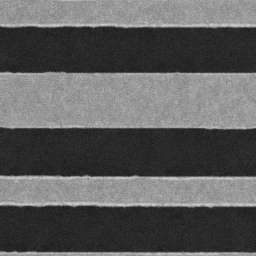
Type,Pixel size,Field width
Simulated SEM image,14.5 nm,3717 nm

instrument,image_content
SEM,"lines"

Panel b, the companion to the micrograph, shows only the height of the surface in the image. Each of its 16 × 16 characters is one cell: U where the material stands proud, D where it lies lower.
UUUUUUUUUUUUUUUU
UUUUUUUUUUUUUUUU
DDDDDDDDDDDDDDDD
DDDDDDDDDDDDDDDD
DDDDDDDDDDDDDDDD
UUUUUUUUUUUUUUUU
UUUUUUUUUUUUUUUU
UUUUUUUUUUUUUUUU
DDDDDDDDDDDDDDDD
DDDDDDDDDDDDDDDD
DDDDDDDDDDDDDDDD
UUUUUUUUUUUUUUUU
UUUUUUUUUUUUUUUU
DDDDDDDDDDDDDDDD
DDDDDDDDDDDDDDDD
DDDDDDDDDDDDDDDD